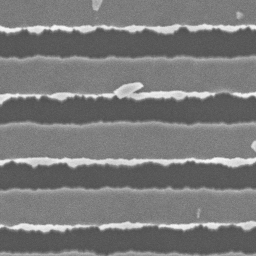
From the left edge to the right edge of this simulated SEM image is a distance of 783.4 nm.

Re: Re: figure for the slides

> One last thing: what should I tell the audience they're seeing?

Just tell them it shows lines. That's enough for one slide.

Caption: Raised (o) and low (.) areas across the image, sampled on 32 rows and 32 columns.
oooooooooooooooooooooooooooooooo
oooooooooooooooooooooooooooooooo
oooooooooooooooooooooooooooooooo
oooooooooooooooooooooooooooooooo
................................
................................
................................
oooooooooooooooooooooooooooooooo
oooooooooooooooooooooooooooooooo
oooooooooooooooooooooooooooooooo
oooooooooooooooooooooooooooooooo
oooooooooooooooooooooooooooooooo
o...............................
................................
................................
.oooo......ooooooooooo..o..o.ooo
oooooooooooooooooooooooooooooooo
oooooooooooooooooooooooooooooooo
oooooooooooooooooooooooooooooooo
oooooooooooooooooooooooooooooooo
o...ooo.ooo.o.ooo...o.......ooo.
................................
................................
.............o..................
oooooooooooooooooooooooooooooooo
oooooooooooooooooooooooooooooooo
oooooooooooooooooooooooooooooooo
oooooooooooooooooooooooooooooooo
.oooooooo...ooooo....ooo..o...oo
................................
................................
........oo......o...............